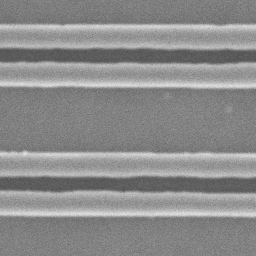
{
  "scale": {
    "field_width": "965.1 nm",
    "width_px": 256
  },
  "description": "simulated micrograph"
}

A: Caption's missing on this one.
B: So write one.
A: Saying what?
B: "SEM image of lines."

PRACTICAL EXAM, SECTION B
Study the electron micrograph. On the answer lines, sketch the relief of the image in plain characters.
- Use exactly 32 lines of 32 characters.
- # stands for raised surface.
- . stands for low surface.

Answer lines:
................................
................................
................................
################################
################################
################################
................................
................................
################################
################################
################################
................................
................................
................................
................................
................................
................................
................................
................................
################################
################################
################################
................................
................................
################################
################################
################################
................................
................................
................................
................................
................................